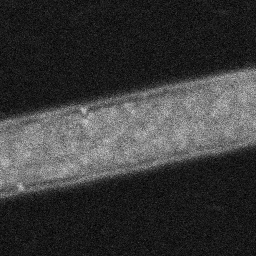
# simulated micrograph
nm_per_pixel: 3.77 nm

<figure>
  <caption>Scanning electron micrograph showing one or a few lines or trenches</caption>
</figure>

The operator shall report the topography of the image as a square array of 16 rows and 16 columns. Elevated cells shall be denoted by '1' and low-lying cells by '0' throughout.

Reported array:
1111111111111111
1111111111111111
1111111111111111
1111111111111111
1111111111111111
1111111111100000
1111111000000000
1100000000000000
0000000000000000
0000000000001111
0000000011111111
0001111111111111
1111111111111111
1111111111111111
1111111111111111
1111111111111111